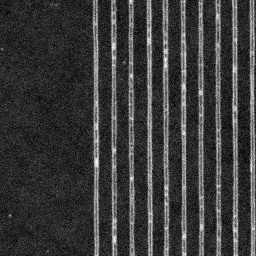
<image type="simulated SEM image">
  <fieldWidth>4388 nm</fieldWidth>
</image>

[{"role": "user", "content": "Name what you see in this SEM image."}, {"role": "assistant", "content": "parallel lines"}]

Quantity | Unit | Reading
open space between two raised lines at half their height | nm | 238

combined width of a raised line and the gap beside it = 17.4 pixels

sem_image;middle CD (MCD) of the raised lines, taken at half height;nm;57.8